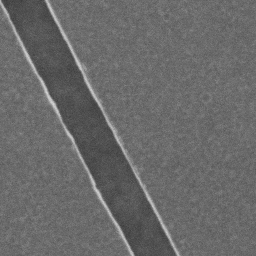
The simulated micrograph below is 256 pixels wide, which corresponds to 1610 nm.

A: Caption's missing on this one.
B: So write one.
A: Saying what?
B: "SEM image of one or a few lines or trenches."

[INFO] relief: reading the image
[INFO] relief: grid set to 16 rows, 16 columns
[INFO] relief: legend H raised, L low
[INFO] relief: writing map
LLLHHHHHHHHHHHHH
HLLLHHHHHHHHHHHH
HLLLHHHHHHHHHHHH
HHLLLHHHHHHHHHHH
HHLLLHHHHHHHHHHH
HHHLLLHHHHHHHHHH
HHHLLLHHHHHHHHHH
HHHHLLLHHHHHHHHH
HHHHLLLHHHHHHHHH
HHHHHLLLHHHHHHHH
HHHHHLLLHHHHHHHH
HHHHHHLLLHHHHHHH
HHHHHHLLLHHHHHHH
HHHHHHHLLLHHHHHH
HHHHHHHHLLHHHHHH
HHHHHHHHLLLHHHHH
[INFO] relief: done